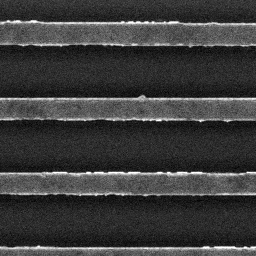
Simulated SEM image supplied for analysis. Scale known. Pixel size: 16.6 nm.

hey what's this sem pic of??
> lines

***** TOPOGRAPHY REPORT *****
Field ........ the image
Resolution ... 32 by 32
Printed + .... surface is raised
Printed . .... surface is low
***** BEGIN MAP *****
................................
................................
................................
++++++++++++++++++++++++++++++++
++++++++++++++++++++++++++++++++
..+++++++....+++++++++++++++++++
................................
................................
................................
................................
................................
................................
++++++++++++++++++++++++++++++++
++++++++++++++++++++++++++++++++
++++++++++++++++++++++++++++++++
................................
................................
................................
................................
................................
................................
................................
++++++++++++++++++++++++++++++++
++++++++++++++++++++++++++++++++
................................
................................
................................
................................
................................
................................
................................
++++++++++++++++++++++++++++++++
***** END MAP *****